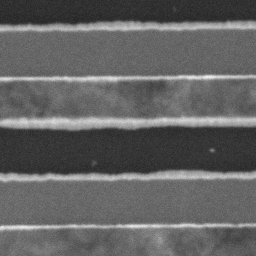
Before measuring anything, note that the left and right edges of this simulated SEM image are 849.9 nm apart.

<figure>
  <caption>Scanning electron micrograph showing lines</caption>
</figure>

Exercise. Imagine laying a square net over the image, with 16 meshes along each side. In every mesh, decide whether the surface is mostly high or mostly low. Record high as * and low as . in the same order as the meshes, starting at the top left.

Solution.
................
................
****************
****************
****************
****************
****************
****************
................
................
................
****************
****************
****************
****************
****************